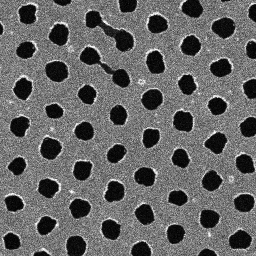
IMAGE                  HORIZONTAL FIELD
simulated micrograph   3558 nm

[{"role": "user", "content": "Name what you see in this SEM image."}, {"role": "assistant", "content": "a regular array of holes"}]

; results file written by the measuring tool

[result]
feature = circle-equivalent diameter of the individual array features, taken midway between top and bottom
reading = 19.5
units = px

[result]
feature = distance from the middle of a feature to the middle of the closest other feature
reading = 514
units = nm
